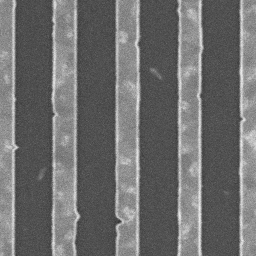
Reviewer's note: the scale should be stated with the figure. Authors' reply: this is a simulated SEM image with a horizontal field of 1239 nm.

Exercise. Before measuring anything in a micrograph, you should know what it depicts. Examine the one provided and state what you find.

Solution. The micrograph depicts one or a few lines or trenches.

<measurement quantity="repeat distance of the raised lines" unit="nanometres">304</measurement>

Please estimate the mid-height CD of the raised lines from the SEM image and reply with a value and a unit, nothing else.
101 nanometers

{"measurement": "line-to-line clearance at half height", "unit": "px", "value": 41.8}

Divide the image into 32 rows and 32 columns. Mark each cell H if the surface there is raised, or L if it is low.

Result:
HHLLLLLHHLLLLLLHHLLLLLHHHLLLLLHH
HHLLLLLHHLLLLLLHHLLLLLHHHLLLLLHH
HHLLLLLHHLLLLLLHHLLLLLLHHLLLLLHH
HHLLLLLHHLLLLLLHHLLLLLLHHLLLLLHH
HHLLLLLHHLLLLLLHHLLLLLHHHLLLLLHH
HHLLLLLHHLLLLLLHHLLLLLHHHLLLLLHH
HHLLLLLHHLLLLLLHHLLLLLHHHLLLLLHH
HHLLLLLHHLLLLLLHHLLLLLHHHLLLLLHH
HHLLLLLHHLLLLLLHHLLLLLHHHLLLLLHH
HHLLLLLHHLLLLLLHHLLLLLHHHLLLLLHH
HHLLLLLHHLLLLLLHHLLLLLLHHLLLLLHH
HHLLLLLHHLLLLLLHHLLLLLLHHLLLLLHH
HHLLLLLHHLLLLLLHHLLLLLLHHLLLLLHH
HHLLLLLHHLLLLLLHHLLLLLLHHLLLLLHH
HHLLLLLHHLLLLLLHHLLLLLLHHLLLLLHH
HHLLLLLHHLLLLLLHHLLLLLLHHLLLLLHH
HHLLLLLHHLLLLLLHHLLLLLLHHLLLLLHH
HHLLLLLHHLLLLLLHHLLLLLLHHLLLLLHH
HHLLLLLHHLLLLLLHHLLLLLHHHLLLLLHH
HHLLLLLHHLLLLLLHHLLLLLLHHLLLLLHH
HHLLLLLHHLLLLLLHHLLLLLLHHLLLLLHH
HHLLLLLHHLLLLLLHHLLLLLLHHLLLLLHH
HHLLLLLHHLLLLLLHHLLLLLLHHLLLLLHH
HHLLLLLHHLLLLLLHHLLLLLLHHLLLLLHH
HHLLLLLHHLLLLLLHHLLLLLLHHLLLLLHH
HHLLLLLHHLLLLLLHHLLLLLHHHLLLLLHH
HHLLLLLHHHLLLLLHHLLLLLHHHLLLLLHH
HHLLLLLHHHLLLLLHHLLLLLLHHLLLLLHH
HHLLLLLHHLLLLLLHHLLLLLLHHLLLLLHH
HHLLLLLHHLLLLLLHHLLLLLHHHLLLLLHH
HHLLLLLHHLLLLLLHHLLLLLHHHLLLLLHH
HHLLLLLHHLLLLLLHHLLLLLHHHLLLLLHH